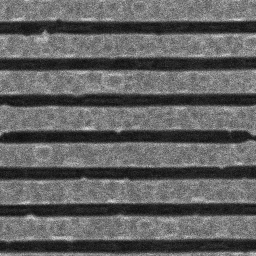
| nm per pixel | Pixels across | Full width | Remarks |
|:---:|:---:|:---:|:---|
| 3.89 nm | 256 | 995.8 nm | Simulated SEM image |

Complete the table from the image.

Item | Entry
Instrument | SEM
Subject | parallel lines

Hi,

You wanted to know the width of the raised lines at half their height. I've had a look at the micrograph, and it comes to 96.7 nanometres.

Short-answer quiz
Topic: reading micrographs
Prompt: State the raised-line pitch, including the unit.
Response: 142 nanometres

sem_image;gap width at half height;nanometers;44.7